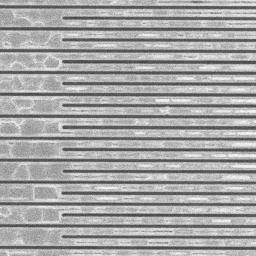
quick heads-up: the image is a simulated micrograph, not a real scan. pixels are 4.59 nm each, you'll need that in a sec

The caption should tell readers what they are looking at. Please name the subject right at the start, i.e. parallel lines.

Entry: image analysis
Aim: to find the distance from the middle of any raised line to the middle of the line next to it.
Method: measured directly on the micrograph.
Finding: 0.0501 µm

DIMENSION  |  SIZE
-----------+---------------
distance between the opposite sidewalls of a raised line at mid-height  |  35.5 nanometres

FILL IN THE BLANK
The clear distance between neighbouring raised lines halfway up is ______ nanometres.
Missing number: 13.2